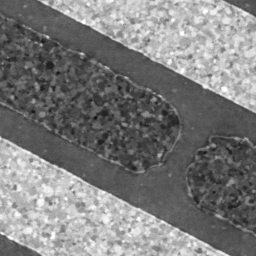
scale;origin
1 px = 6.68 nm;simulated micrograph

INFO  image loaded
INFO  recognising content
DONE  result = one or a few lines or trenches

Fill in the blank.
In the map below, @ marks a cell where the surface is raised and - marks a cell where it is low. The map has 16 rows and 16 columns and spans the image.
---@@@@@@@@@@@@-
@----@@@@@@@@@@@
@@@----@@@@@@@@@
@@@@@----@@@@@@@
@@@@@@@----@@@@@
@@@@@@@@@----@@@
@@@@@@@@@@@----@
--@@@@@@@@@-----
----@@@@@@@-----
@@----@@@@@-@@@@
@@@@----@---@@@@
@@@@@@------@@@@
@@@@@@@-----@@@@
@@@@@@@@@-----@@
@@@@@@@@@@@-----
--@@@@@@@@@@@---